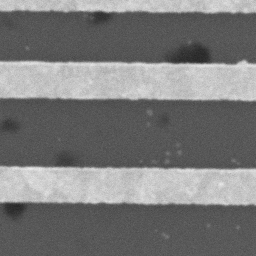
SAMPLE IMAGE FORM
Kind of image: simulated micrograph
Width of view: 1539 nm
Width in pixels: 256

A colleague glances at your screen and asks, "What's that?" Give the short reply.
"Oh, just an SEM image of lines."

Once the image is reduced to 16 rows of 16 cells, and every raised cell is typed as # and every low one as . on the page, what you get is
################
................
................
................
################
################
................
................
................
................
#...............
################
################
................
................
................